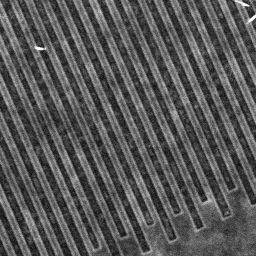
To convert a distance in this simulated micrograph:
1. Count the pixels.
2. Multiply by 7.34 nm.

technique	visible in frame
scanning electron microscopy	parallel lines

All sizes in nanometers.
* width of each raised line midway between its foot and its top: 39.5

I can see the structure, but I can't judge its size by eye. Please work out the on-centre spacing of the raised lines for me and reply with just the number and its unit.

108 nm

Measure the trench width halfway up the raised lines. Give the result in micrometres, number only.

0.0664